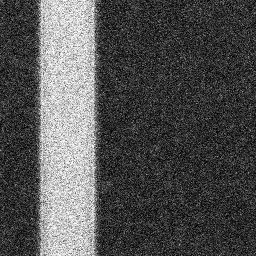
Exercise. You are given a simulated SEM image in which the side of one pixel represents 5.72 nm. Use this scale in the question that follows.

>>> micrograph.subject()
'one or a few lines or trenches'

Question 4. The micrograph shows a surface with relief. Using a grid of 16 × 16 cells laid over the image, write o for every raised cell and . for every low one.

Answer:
ooo...oooooooooo
ooo...oooooooooo
ooo...oooooooooo
ooo...oooooooooo
ooo...oooooooooo
ooo...oooooooooo
ooo...oooooooooo
ooo...oooooooooo
ooo...oooooooooo
ooo...oooooooooo
ooo...oooooooooo
ooo...oooooooooo
ooo...oooooooooo
ooo...oooooooooo
ooo...oooooooooo
ooo...oooooooooo